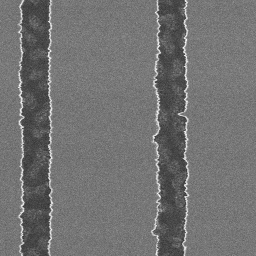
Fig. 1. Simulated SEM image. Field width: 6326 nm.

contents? one or a few lines or trenches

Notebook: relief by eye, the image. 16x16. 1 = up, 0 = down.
1001111111001111
1001111111001111
1001111111001111
1001111111001111
1001111111001111
1001111111001111
1001111111001111
1001111111001111
1001111111001111
1001111111001111
1001111111001111
1001111111001111
1001111111001111
1001111111001111
1001111111001111
1001111111001111